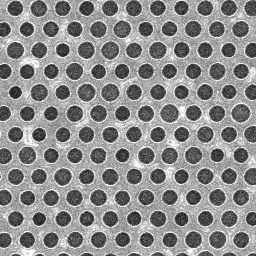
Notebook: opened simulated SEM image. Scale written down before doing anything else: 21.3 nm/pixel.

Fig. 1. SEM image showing a regular array of holes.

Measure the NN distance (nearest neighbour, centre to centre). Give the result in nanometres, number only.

502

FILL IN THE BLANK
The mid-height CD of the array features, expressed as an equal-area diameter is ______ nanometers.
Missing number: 347